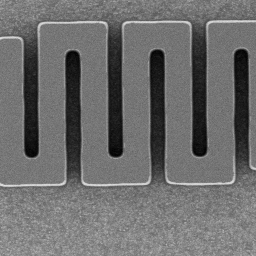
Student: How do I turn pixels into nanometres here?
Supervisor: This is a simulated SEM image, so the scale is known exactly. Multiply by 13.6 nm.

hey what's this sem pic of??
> groups of lines, slits or small figures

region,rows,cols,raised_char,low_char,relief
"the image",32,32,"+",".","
................................
................................
................................
.....++++++++..+++++++++..++++++
.....++++++++..+++++++++..++++++
+++..++++++++..+++++++++..++++++
+++..++++.+++..++++.++++..+++..+
+++..+++..+++..++++..+++..+++..+
+++..+++..+++..++++..+++..+++..+
+++..+++..+++..++++..+++..+++..+
+++..+++..+++..++++..+++..+++..+
+++..+++..+++..++++..+++..+++..+
+++..+++..+++..++++..+++..+++..+
+++..+++..+++..++++..+++..+++..+
+++..+++..+++..++++..+++..+++..+
+++..+++..+++..++++..+++..+++..+
+++..+++..+++..++++..+++..+++..+
+++..+++..++++.++++..+++..+++..+
+++..+++..++++.++++..+++..+++..+
+++..+++..++++.++++..++++++++..+
++++++++..+++++++++..++++++++..+
++++++++..+++++++++..++++++++...
++++++++..+++++++++..++++++++...
................................
................................
................................
................................
................................
................................
................................
................................
................................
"